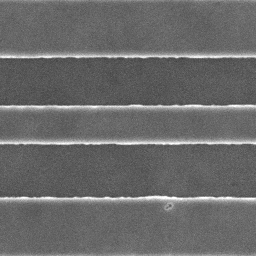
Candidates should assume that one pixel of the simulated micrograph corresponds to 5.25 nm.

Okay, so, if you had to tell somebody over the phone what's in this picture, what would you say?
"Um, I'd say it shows lines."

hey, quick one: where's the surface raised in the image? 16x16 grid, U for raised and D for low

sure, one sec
UUUUUUUUUUUUUUUU
UUUUUUUUUUUUUUUU
UUUUUUUUUUUUUUUU
UUUUUUUUUUUUUUUU
DDDDDDDDDDDDDDDD
DDDDDDDDDDDDDDDD
DDDDDDDDDDDDDDDD
UUUUUUUUUUUUUUUU
UUUUUUUUUUUUUUUU
DDDDDDDDDDDDDDDD
DDDDDDDDDDDDDDDD
DDDDDDDDDDDDDDDD
UUUUUUUUUUUUUUUU
UUUUUUUUUUUUUUUU
UUUUUUUUUUUUUUUU
UUUUUUUUUUUUUUUU